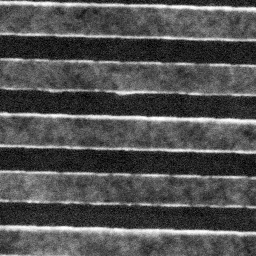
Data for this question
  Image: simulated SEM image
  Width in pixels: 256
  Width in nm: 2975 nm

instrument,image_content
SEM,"lines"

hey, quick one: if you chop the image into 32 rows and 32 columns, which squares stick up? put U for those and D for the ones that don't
UUUUUUUUUDDDDDDDDDDDDDDDDDDDDDDD
UUUUUUUUUUUUUUUUUUUUUUUUUUUUUUUU
UUUUUUUUUUUUUUUUUUUUUUUUUUUUUUUU
UUUUUUUUUUUUUUUUUUUUUUUUUUUUUUUU
DDDDDDDDDDDUUUUUUUUUUUUUUUUUUUUU
DDDDDDDDDDDDDDDDDDDDDDDDDDDDDDDD
DDDDDDDDDDDDDDDDDDDDDDDDDDDDDDDD
UUDDDDDDDDDDDDDDDDDDDDDDDDDDDDDD
UUUUUUUUUUUUUUUUUUUUUUUUUUUUUUUU
UUUUUUUUUUUUUUUUUUUUUUUUUUUUUUUU
UUUUUUUUUUUUUUUUUUUUUUUUUUUUUUUU
DDDDDDDDDDDDDDDUUUUUUUUUUUUUUUUU
DDDDDDDDDDDDDDDDDDDDDDDDDDDDDDDD
DDDDDDDDDDDDDDDDDDDDDDDDDDDDDDDD
UUUUUUUUUUUDDDDDDDDDDDDDDDDDDDDD
UUUUUUUUUUUUUUUUUUUUUUUUUUUUUUUU
UUUUUUUUUUUUUUUUUUUUUUUUUUUUUUUU
UUUUUUUUUUUUUUUUUUUUUUUUUUUUUUUU
DDDDDDDDDUUUUUUUUUUUUUUUUUUUUUUU
DDDDDDDDDDDDDDDDDDDDDDDDDDDDDDDD
DDDDDDDDDDDDDDDDDDDDDDDDDDDDDDDD
UUDDDDDDDDDDDDDDDDDDDDDDDDDDDDDD
UUUUUUUUUUUUUUUUUUUUUUUUUUUUUUUU
UUUUUUUUUUUUUUUUUUUUUUUUUUUUUUUU
UUUUUUUUUUUUUUUUUUUUUUUUUUUUUUUU
DDDDDDDDDDDDDDDDDDUUUUUUUUUUUUUU
DDDDDDDDDDDDDDDDDDDDDDDDDDDDDDDD
DDDDDDDDDDDDDDDDDDDDDDDDDDDDDDDD
UUUUUDDDDDDDDDDDDDDDDDDDDDDDDDDD
UUUUUUUUUUUUUUUUUUUUUUUUUUUUUUUU
UUUUUUUUUUUUUUUUUUUUUUUUUUUUUUUU
UUUUUUUUUUUUUUUUUUUUUUUUUUUUUUUU